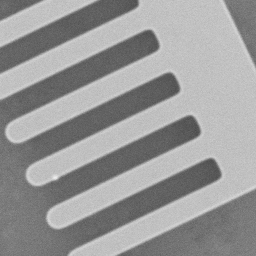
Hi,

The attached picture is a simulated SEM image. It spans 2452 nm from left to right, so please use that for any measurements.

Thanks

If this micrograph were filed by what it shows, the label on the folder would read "groups of lines, slits or small figures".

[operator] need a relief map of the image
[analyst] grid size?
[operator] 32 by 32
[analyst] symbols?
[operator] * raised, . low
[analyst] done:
.....******......***********....
..*******.......*************...
*******.......***************...
*****.......*****************...
***.......*******...**********..
*.......******......**********..
......******.......************.
....******........*************.
..******.......*****************
******.......*******..**********
****.......*******....**********
**.......*******......**********
.......*******.......***********
.....*******.......*************
...******........******.********
.******........******....*******
.****........******......*******
.**.......*******.......********
........*******.......**********
......*******.......************
....*******.......******...*****
...******.......******......****
....***.......******.......*****
............******.......*******
.........*******.......*******..
........******.......*******....
......******.......*******......
......****.......*******........
.......*.......*******..........
.............******.............
...........******...............
.........******.................